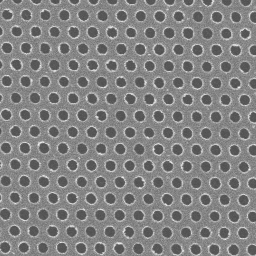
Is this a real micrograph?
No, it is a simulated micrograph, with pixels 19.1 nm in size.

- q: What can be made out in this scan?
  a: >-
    a regular array of holes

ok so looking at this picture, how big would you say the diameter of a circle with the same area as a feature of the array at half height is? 194 nm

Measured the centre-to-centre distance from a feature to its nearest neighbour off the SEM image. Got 357 nm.